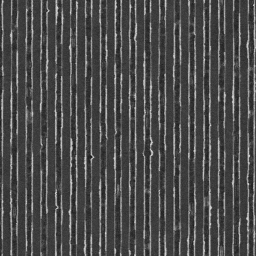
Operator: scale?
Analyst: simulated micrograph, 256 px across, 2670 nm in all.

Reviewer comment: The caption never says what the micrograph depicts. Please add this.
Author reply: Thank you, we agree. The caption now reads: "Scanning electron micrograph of parallel lines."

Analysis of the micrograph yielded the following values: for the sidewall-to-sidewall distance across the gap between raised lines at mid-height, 80.9 nm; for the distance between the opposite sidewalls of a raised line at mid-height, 71.7 nm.